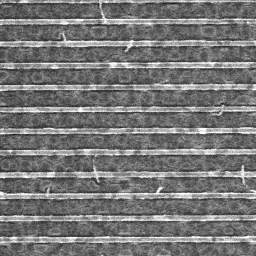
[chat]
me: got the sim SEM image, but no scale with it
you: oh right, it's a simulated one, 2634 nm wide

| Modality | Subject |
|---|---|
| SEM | parallel lines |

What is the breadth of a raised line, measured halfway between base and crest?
50.1 nanometres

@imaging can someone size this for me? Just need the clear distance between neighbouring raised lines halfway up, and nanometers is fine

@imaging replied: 170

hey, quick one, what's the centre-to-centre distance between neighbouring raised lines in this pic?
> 21.8 px